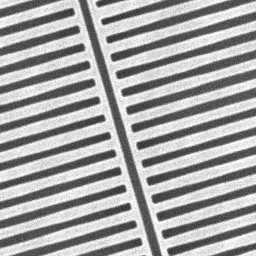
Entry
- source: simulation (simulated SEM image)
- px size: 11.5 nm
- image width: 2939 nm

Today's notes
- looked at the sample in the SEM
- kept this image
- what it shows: groups of lines, slits or small figures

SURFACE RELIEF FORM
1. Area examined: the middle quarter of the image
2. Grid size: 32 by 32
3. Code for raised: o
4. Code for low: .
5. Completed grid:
o......o...oooooo.......oooooooo
.....oooo..ooo.......oooooooooo.
..ooooooo..oo.....ooooooooo.....
ooooooooo...o..ooooooooo.......o
ooo.....o...oooooooo........oooo
........oo..ooooo.......oooooooo
.....ooooo..oo........oooooooo..
..oooooooo...o....oooooooo......
ooooooo..oo..oooooooooo........o
ooo......oo..ooooooo........oooo
.......oooo...oo........oooooooo
....oooooooo..o......oooooooo...
.ooooooooooo..oo..oooooooo......
oooooo....oo...oooooooo........o
ooo.......oo...oooo........ooooo
.......oooooo..oo......ooooooooo
...oooooooooo..oo...ooooooooo...
oooooooo....o...ooooooooo.......
ooooo.......oo..oooooo.......ooo
oo.......ooooo..oo.......ooooooo
......oooooooo...o....ooooooooo.
..ooooooooo..o...ooooooooooo....
oooooooo.....oo..ooooooo.......o
oooo........ooo..oooo.......oooo
o........oooooo...o......ooooooo
.....ooooooooooo..oo..ooooooooo.
..ooooooooo...oo..ooooooooo.....
ooooooo.......oo...oooo........o
oooo........oooo...oo.......oooo
........ooooooooo..oo....ooooooo
.....ooooooooo.oo...o.oooooooo..
..oooooooo......o...oooooo......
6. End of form